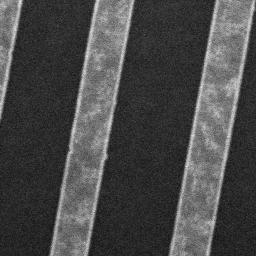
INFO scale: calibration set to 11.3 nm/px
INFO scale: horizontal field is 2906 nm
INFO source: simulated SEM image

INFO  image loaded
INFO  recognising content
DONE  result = one or a few lines or trenches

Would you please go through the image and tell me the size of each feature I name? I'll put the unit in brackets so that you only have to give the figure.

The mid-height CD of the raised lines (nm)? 409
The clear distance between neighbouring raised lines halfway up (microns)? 0.94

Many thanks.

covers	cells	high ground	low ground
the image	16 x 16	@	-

@-----@@-----@@@
@-----@@-----@@@
@-----@@-----@@-
@----@@@-----@@-
-----@@------@@-
-----@@------@@-
-----@@-----@@@-
-----@@-----@@--
-----@@-----@@--
----@@@-----@@--
----@@------@@--
----@@-----@@@--
----@@-----@@@--
----@@-----@@---
---@@@-----@@---
---@@------@@---